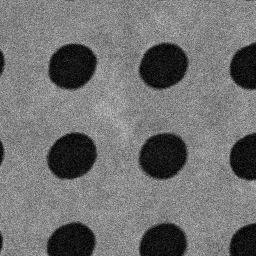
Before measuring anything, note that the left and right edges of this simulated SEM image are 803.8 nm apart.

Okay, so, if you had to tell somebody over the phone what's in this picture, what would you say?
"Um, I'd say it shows holes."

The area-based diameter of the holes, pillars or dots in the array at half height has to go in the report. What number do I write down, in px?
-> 48.6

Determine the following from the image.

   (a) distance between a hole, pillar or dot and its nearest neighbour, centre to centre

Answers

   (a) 282 nanometers